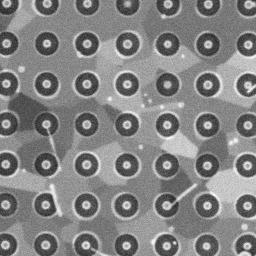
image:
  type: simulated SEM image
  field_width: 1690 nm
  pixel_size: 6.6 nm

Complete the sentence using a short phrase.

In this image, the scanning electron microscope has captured an array of small figures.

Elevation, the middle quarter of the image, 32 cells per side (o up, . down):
oooooooooooooooooooooooooooooooo
oooooooooooooooooooooooooooooooo
oooo....oooooo...ooooooo...ooooo
ooo......oooo.....ooooo......ooo
ooo..o...oooo..o...oooo......ooo
oo...o...oooo..o...oooo......ooo
ooo.....ooooo......oooo......ooo
oooo....oooooo....oooooo....oooo
oooooooooooooooooooooooooooooooo
oooooooooooooooooooooooooooooooo
oooooooooooooooooooooooooooooooo
oooooooooooooooooooooooooooooooo
oooo...ooooooo....oooooo...ooooo
ooo.....ooooo......oooo.....oooo
ooo..o...oooo......oooo......ooo
ooo..oo..oooo..oo..oooo..o...ooo
ooo.....ooooo.....ooooo......ooo
oooo....oooooo....oooooo....oooo
ooooooooooooooooooooooooo.oooooo
oooooooooooooooooooooooooooooooo
oooooooooooooooooooooooooooooooo
oooooooooooooooooooooooooooooooo
oooo...ooooooo...oooooooo..ooooo
ooo.....ooooo.....ooooo.....oooo
ooo..o...oooo......oooo......ooo
oo...oo..oooo..o...ooo...oo..ooo
ooo......oooo......oooo......ooo
oooo....oooooo....ooooo.....oooo
ooooooooooooooooooooooooo.oooooo
oooooooooooooooooooooooooooooooo
oooooooooooooooooooooooooooooooo
oooooooooooooooooooooooooooooooo